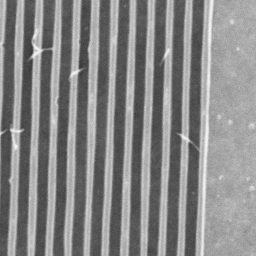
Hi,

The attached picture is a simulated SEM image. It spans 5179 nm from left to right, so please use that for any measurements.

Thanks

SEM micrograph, parallel lines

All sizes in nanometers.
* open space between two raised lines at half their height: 240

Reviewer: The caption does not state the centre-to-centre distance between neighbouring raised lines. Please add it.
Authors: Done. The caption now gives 379 nm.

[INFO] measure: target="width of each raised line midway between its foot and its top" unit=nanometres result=136